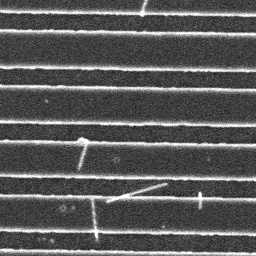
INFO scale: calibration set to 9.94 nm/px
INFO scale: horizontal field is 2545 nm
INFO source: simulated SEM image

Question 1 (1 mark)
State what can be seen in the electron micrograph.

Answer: lines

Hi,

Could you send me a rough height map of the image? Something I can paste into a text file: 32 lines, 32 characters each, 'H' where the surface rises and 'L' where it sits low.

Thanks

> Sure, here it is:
HHHHHHHHHHHHHHHHHHHHHHHHHHHHHHHH
HHHHHHHHHHHHHHHHHHHHHHHHHHHHHHHH
LLLLLLLLLLLLLLLLLLLLLLLLLLLLLLLL
LLLLLLLLLLLLLLLLLLLLLLLLLLLLLLLL
HHHHHHHHHHHHHHHHHHHHHHHHHHHHHHHH
HHHHHHHHHHHHHHHHHHHHHHHHHHHHHHHH
HHHHHHHHHHHHHHHHHHHHHHHHHHHHHHHH
HHHHHHHHHHHHHHHHHHHHHHHHHHHHHHHH
HHLHHHHHHHHHHHHHHHHHHHHHHHHHHHHH
LLLLLLLLLLLLLLLLLLLLLLLLLLLLLLLL
LLLLLLLLLLLLLLLLLLLLLLLLLLLLLLLL
HHHHHHHHHHHHHHHHHHHHHHHHHHHHHHHH
HHHHHHHHHHHHHHHHHHHHHHHHHHHHHHHH
HHHHHHHHHHHHHHHHHHHHHHHHHHHHHHHH
HHHHHHHHHHHHHHHHHHHHHHHHHHHHHHHH
LLLLLLLLLLLLHHHHHHHHHHHHHHHHHHHH
LLLLLLLLLLLLLLLLLLLLLLLLLLLLLLLL
LLLLLLLLLLHLLLLLLLLLLLLLLLLLLLLL
HHHHHHHHHHHHHHHHHHHHHHHHHHHHHHHH
HHHHHHHHHHHHHHHHHHHHHHHHHHHHHHHH
HHHHHHHHHHHHHHHHHHHHHHHHHHHHHHHH
HHHHHHHHHHHHHHHHHHHHHHHHHHHHHHHH
LLLLLLLLLLLLLLLLLLLLLLLLLLLLHHHH
LLLLLLLLLLLLLLLLLLLLLLLLLLLLLLLL
HHHHHHLLHLLLLLLHLLLLLLLLLLLLLLLL
HHHHHHHHHHHHHHHHHHHHHHHHHHHHHHHH
HHHHHHHHHHHHHHHHHHHHHHHHHHHHHHHH
HHHHHHHHHHHHHHHHHHHHHHHHHHHHHHHH
HHHHHHHHHHHHHHHHHHHHHHHHHHHHHHHH
LLLLLLLLLLLLLLLLLLLLLLLLLLLLLLLL
LLLLLLLLLLLLLLLLLLLLLLLLLLLLLLLL
HHHHHHHHHHHHHHHHHLLLLLLLLLLLLLLL